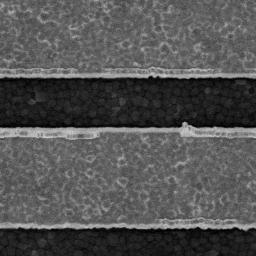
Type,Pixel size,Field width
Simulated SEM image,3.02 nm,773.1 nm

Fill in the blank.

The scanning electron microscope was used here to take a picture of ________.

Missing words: one or a few lines or trenches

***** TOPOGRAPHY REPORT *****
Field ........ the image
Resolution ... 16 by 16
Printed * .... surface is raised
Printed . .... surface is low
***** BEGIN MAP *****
****************
****************
****************
****************
****************
................
................
................
****************
****************
****************
****************
****************
****************
................
................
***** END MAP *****